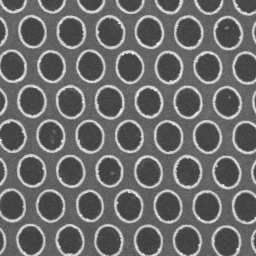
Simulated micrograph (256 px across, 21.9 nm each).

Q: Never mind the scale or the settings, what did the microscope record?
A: a regular array of raised bodies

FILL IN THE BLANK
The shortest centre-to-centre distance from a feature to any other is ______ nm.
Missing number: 855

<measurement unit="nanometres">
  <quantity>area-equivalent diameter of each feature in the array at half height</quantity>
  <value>644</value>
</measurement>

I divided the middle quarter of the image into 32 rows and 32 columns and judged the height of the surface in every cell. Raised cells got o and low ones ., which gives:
...ooooooo...ooooooo...oooooo...
...ooooooo...ooooooo...oooooo...
....oooooo...oooooo....oooooo...
.....oooo.....ooooo.....ooooo...
......o........oo........oo.....
................................
oooo.....ooooo.....oooo......ooo
oooo....oooooo....oooooo....oooo
ooooo...ooooooo...oooooo....oooo
ooooo...ooooooo...oooooo....oooo
ooooo...ooooooo...oooooo....oooo
ooooo....oooooo....ooooo....oooo
oooo.....ooooo.....oooo......ooo
................................
.....ooo.......ooo.......oo.....
....ooooo.....ooooo....oooooo...
...oooooo....oooooo....oooooo...
...ooooooo...oooooo....ooooooo..
...ooooooo...oooooo....ooooooo..
...ooooooo...oooooo....ooooooo..
....ooooo.....ooooo....oooooo...
.....ooo.......ooo......oooo....
................................
ooo.......ooo.......oo.......ooo
oooo.....ooooo.....oooo.....oooo
ooooo...oooooo....oooooo....oooo
ooooo...ooooooo...oooooo....oooo
ooooo...ooooooo...oooooo....oooo
ooooo...oooooo....oooooo....oooo
oooo.....ooooo.....ooooo....oooo
.oo.................ooo.......oo
................................